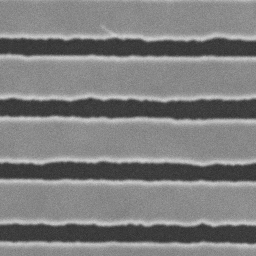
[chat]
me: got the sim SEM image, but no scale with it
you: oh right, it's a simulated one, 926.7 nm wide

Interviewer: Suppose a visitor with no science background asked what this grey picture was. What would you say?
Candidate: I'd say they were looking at lines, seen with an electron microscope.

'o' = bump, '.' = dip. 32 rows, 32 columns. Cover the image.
oooooooooooooooooooooooooooooooo
oooooooooooooooooooooooooooooooo
oooooooooooooooooooooooooooooooo
oooooooooooooooooooooooooooooooo
oooooooooooooooooooooooooooooooo
................................
................................
oooooooooooooooooooooooooooooooo
oooooooooooooooooooooooooooooooo
oooooooooooooooooooooooooooooooo
oooooooooooooooooooooooooooooooo
oooooooooooooooooooooooooooooooo
.....o..o........o.ooooo........
................................
................................
oooooooooooooooooooooooooooooooo
oooooooooooooooooooooooooooooooo
oooooooooooooooooooooooooooooooo
oooooooooooooooooooooooooooooooo
oooooooooooooooooooooooooooooooo
........................ooo..oo.
................................
oooooo.oo..o....................
oooooooooooooooooooooooooooooooo
oooooooooooooooooooooooooooooooo
oooooooooooooooooooooooooooooooo
oooooooooooooooooooooooooooooooo
oooooooooooooooooooooooooooooooo
................................
................................
ooooooooooooooooooooooooooooooo.
oooooooooooooooooooooooooooooooo